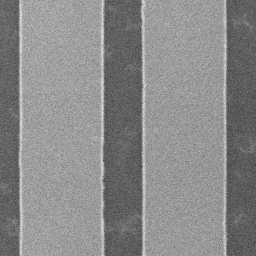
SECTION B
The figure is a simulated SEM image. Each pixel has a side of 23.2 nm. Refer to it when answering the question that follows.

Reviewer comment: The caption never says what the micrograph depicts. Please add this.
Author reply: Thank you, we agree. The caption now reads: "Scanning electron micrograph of one or a few lines or trenches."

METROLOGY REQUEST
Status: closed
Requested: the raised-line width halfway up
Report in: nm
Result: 1900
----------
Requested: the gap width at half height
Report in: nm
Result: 940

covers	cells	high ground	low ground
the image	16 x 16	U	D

DUUUUUDDDUUUUUDD
DUUUUUDDDUUUUUDD
DUUUUUDDDUUUUUDD
DUUUUUDDDUUUUUDD
DUUUUUDDDUUUUUDD
DUUUUUDDDUUUUUDD
DUUUUUDDDUUUUUDD
DUUUUUDDDUUUUUDD
DUUUUUDDDUUUUUDD
DUUUUUDDDUUUUUDD
DUUUUUDDDUUUUUDD
DUUUUUDDDUUUUUDD
DUUUUUDDDUUUUUDD
DUUUUUDDDUUUUUDD
DUUUUUDDDUUUUUDD
DUUUUUDDDUUUUUDD